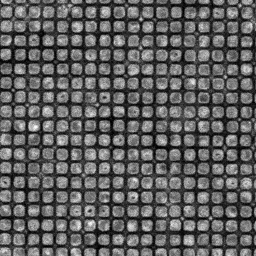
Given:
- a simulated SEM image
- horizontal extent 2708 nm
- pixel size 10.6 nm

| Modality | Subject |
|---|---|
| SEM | a regular array of raised bodies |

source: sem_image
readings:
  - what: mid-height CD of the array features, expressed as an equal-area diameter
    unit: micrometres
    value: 0.118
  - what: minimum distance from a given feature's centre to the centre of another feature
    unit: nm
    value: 144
